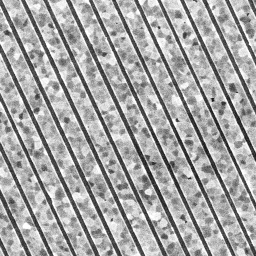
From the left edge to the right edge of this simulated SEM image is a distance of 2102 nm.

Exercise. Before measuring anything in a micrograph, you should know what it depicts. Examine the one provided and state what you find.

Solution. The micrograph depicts parallel lines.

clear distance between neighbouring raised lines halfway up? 39 nm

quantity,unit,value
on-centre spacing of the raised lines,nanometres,169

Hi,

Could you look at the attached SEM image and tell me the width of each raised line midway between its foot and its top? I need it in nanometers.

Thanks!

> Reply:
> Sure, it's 128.